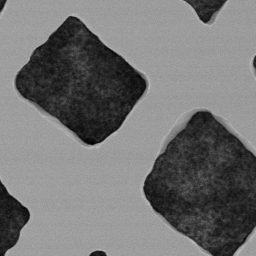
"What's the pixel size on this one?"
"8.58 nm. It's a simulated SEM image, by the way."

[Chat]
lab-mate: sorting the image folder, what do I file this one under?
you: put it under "holes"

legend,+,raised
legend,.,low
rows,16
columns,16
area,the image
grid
++++++++++++..++
++++.+++++++++++
+++...++++++++++
++......++++++++
+........+++++++
+........+++++++
++......++++++++
++++....++++..++
+++++..++++....+
++++++++++......
++++++++++......
+++++++++.......
.++++++++.......
..++++++++......
.++++++++++.....
.++++++++++++..+